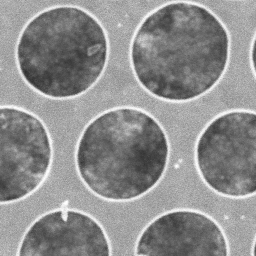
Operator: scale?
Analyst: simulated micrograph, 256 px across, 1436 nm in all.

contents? holes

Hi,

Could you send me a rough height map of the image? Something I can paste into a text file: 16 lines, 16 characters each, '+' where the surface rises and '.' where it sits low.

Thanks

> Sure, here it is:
++++.+++++...+++
++....+++.....++
+......+......++
+......+......++
+.....++......++
++....+++....+++
++++++++++++++++
..++++....+++...
...++.....+++...
...++.....++....
...++.....++....
..+++.....+++...
.++++++.++++++++
+++..+++++...+++
++....+++.....++
+......++.....++